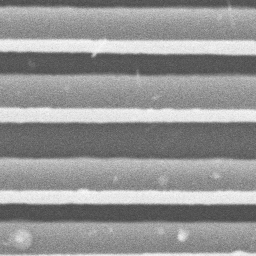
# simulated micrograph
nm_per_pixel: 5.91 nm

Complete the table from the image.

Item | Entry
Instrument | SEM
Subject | lines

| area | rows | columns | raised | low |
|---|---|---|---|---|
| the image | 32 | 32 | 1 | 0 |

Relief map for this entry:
00000000000000000000000000000000
11111111111111111111111111111111
11111111111111111111111111111111
11111111111111111111111111111111
11111111111111111111111111111111
11111111111111111111111111111111
00000000100111111111111111111111
00000000000000000000000000000000
00000000000000000000000000000000
00000000000000000100000000000000
11111111111111111111111111111111
11111111111111111111111111111111
11111111111111111111111111111111
11111111111111111111111111111111
11111111111111111111111111111111
00000000000000000000000000000000
00000000000000000000000000000000
00000000000000000000000000000000
00000000000000000000000000000000
00000000000000000000000000000000
11111111111111111111111111111111
11111111111111111111111111111111
11111111111111111111111111111111
11111111111111111111111111111111
11111111111111111111111111111111
00000000000000000000000111100000
00000000000000000000000000000000
00000000000000000000000000000000
11111111111111111111111111111111
11111111111111111111111111111111
11111111111111111111111111111111
11111111111111111111111111111111